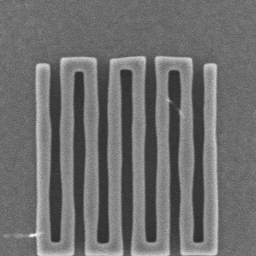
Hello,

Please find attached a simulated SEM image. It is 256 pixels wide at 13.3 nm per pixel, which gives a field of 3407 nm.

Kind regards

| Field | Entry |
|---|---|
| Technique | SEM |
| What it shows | groups of lines, slits or small figures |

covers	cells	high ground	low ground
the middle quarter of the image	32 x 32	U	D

UUUUUUUUDDDDUUUUUUUUDDDUUUUUUUUU
UUUUUUUUDDDDUUDDDUUUDDDUUUUDUUUU
UUUDDUUUDDDDUUDDDUUUDDDUUUDDDUUU
UUDDDUUUDDDUUUDDDUUUDDDUUUDDDUUU
UUDDDUUUDDDUUUDDDUUUDDDUUUDDDUUU
UUDDDUUUDDDUUUDDDUUUDDDUUUDDDUUU
UUDDDUUUDDDUUUDDDUUUDDDUUUDDDUUU
UUDDDUUUDDDUUUDDDUUUDDDUUUDDDUUU
UUDDDUUUDDDUUUDDDUUUDDDUUUDDDUUU
UUDDDUUUDDDUUUDDDUUUDDDUUUDDDUUU
UUDDDUUUUDDUUUDDDUUUDDDUUUDDDUUU
UUDDDUUUUDDUUUDDDUUUDDDUUUDDDUUU
UUDDDUUUUDDUUUDDDUUUDDDUUUDDDUUU
UUDDDUUUUDDUUUDDDUUUDDDUUUDDDUUU
UUDDDUUUUDDUUUDDDUUUDDDUUUDDDUUU
UUDDDUUUDDDUUUDDDUUUDDDUUUDDDUUU
UUDDDUUUDDDUUUDDDUUUDDDUUUDDDUUU
UUDDDUUUDDDUUUDDDUUUDDDUUUDDDUUU
UUDDDUUUDDDUUUDDDUUUDDDUUUDDDUUU
UUDDDUUUDDDUUUDDDUUUDDDUUUDDDUUU
UUDDDUUUDDDUUUDDDUUUDDDUUUDDDUUU
UUDDDUUUDDDUUUDDDUUUDDDUUUDDDUUU
UUDDDUUUDDDUUUDDDUUUDDDDUUDDDUUU
UUDDDUUUDDDUUUDDDUUUDDDUUUDDDUUU
UUDDDUUUDDDUUUDDDUUUDDDUUUDDDUUU
UUDDDUUUDDDUUUDDDUUUDDDUUUDDDUUU
UUDDDUUUUDDUUUDDDUUUDDDUUUDDDUUU
UUDDDUUUUDDUUUDDDUUUDDDUUUDDDUUU
UUDDDUUUUDDUUUDDDUUUDDDUUUDDDUUU
UUDDDUUUUDDUUUDDDUUUDDDUUUDDDUUU
UUDDDUUUUDDUUUDDDUUUDDDUUUDDDUUU
UUDDDUUUUDDUUUDDDUUUDDDUUUDDDUUU